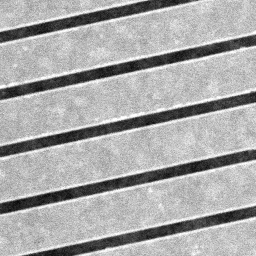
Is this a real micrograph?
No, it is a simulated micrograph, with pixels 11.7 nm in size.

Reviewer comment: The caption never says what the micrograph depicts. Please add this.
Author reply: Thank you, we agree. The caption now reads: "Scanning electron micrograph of parallel lines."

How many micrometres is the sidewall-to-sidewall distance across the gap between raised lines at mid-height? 0.153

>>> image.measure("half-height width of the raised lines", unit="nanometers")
502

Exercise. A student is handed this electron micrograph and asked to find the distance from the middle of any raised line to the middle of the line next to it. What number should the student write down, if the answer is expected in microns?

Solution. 0.655